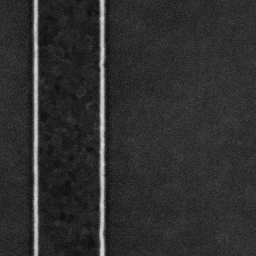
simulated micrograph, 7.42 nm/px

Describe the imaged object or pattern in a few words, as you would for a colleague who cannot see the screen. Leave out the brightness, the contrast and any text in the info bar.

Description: one or a few lines or trenches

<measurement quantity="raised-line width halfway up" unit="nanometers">492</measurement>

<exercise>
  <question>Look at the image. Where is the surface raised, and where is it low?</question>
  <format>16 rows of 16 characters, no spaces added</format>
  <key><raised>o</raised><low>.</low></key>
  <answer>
..oooo..........
..oooo..........
..oooo..........
..oooo..........
..oooo..........
..oooo..........
..oooo..........
..oooo..........
..oooo..........
..oooo..........
..oooo..........
..oooo..........
..oooo..........
..oooo..........
..oooo..........
..oooo..........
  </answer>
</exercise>